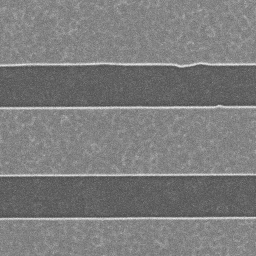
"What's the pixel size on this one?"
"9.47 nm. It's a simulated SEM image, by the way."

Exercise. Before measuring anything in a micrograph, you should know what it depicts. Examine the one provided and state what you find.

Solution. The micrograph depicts one or a few lines or trenches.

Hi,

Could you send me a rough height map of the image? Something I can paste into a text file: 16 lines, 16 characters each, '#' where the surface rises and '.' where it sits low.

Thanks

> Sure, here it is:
################
################
################
################
................
................
................
################
################
################
################
................
................
................
################
################